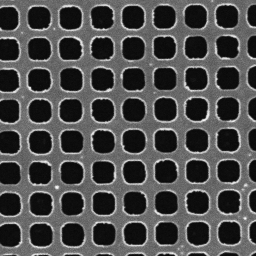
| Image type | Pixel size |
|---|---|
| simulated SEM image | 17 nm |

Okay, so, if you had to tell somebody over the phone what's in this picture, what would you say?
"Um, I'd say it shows a regular array of holes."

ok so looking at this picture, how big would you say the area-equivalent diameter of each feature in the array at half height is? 0.41 microns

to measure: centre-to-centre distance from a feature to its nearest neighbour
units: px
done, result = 30.7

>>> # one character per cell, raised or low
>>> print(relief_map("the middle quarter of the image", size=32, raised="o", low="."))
oooooooooooooooooooooooooooooooo
....ooo.....ooo....oooo....oooo.
.....oo.....ooo.....oo......oo..
.....oo.....ooo.....oo......oo..
.....oo......oo.....oo......oo..
.....oo.....ooo.....ooo.....ooo.
....oooo...ooooo...ooooo...ooooo
oooooooooooooooooooooooooooooooo
oooooooooooooooo..oooooo...ooooo
....ooo.....ooo.....ooo.....ooo.
.....oo.....ooo.....oo......oo..
.....oo......oo.....oo......oo..
.....oo......oo.....oo......ooo.
....oooo....ooo.....ooo.....ooo.
..ooooooooooooooo.oooooooooooooo
oooooooooooooooooooooooooooooooo
o..ooooooooooooo..oooooo...ooooo
....ooo.....ooo.....ooo.....ooo.
.....oo.....ooo.....ooo.....oo..
.....oo......oo......oo.....oo..
.....oo......oo.....ooo.....oo..
....ooo.....ooo.....ooo.....ooo.
oooooooooooooooooooooooooooooooo
oooooooooooooooooooooooooooooooo
o.oooooo....ooo....ooooo...oooo.
.....oo......oo.....ooo.....oo..
.....oo......oo.....ooo.....oo..
.....oo......oo.....ooo.....oo..
.....oo......oo.....ooo.....ooo.
....oooo....oooo....oooo...oooo.
oooooooooooooooooooooooooooooooo
oooooooooooooooooooooooooooooooo